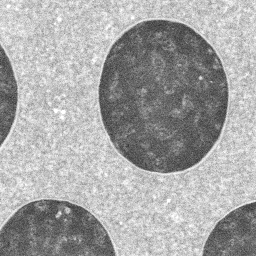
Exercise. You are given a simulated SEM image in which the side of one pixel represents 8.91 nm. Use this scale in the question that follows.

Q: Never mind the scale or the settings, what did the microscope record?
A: holes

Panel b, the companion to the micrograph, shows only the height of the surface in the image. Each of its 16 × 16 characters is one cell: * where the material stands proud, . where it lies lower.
****************
*********...****
*******......***
*******.......**
.*****........**
.*****........**
.*****........**
.*****........**
*******.......**
*******......***
*********...****
****************
**.*************
*.....********..
.......******...
.......******...